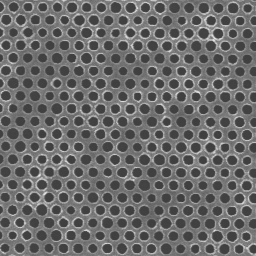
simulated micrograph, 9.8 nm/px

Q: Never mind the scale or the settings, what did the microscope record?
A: a regular array of holes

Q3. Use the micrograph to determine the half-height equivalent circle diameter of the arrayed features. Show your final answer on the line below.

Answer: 0.0939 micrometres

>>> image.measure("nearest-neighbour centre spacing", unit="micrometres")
0.141